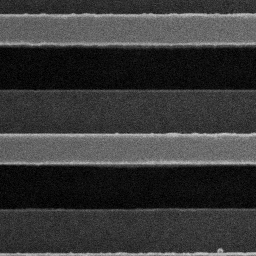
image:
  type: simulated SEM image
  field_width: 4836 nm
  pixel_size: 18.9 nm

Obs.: lines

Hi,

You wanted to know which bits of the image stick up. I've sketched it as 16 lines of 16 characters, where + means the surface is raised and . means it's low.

++++++++++++++++
++++++++++++++++
++++++++++++++++
................
................
................
++++++++++++++++
++++++++++++++++
++++++++++++++++
++++++++++++++++
................
................
................
++++++++++++++++
++++++++++++++++
++++++++++++++++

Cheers